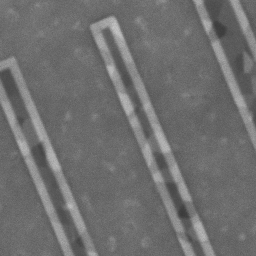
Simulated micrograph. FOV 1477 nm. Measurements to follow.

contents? one or a few lines or trenches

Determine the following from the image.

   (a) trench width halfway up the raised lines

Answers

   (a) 0.51 micrometres